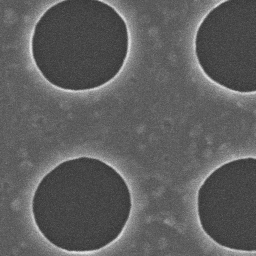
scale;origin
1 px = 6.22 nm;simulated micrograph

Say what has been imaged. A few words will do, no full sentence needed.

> holes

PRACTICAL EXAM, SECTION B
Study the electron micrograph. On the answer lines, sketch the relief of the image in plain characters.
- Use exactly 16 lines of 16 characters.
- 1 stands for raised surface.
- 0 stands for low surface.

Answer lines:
1110000111111000
1100000011111000
1100000011110000
1100000011110000
1110000111111000
1111001111111100
1111111111111111
1111111111111111
1111111111111111
1111111111111111
1110000111111100
1100000011111000
1100000011110000
1100000011110000
1110000011111000
1111001111111100